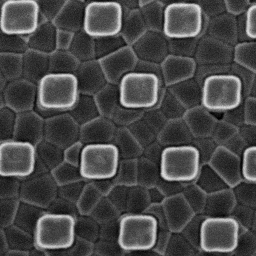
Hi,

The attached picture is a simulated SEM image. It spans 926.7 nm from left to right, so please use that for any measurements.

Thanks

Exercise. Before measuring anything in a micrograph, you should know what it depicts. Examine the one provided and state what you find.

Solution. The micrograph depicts a regular array of raised bodies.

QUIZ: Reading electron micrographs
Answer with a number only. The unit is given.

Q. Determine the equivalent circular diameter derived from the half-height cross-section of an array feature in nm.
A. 134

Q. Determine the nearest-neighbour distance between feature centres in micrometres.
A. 0.293